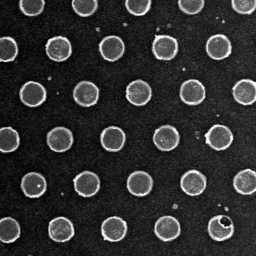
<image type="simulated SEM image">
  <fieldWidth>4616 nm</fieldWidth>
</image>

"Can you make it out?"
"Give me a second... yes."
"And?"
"a regular array of raised bodies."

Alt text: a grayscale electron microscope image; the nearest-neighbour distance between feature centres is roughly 0.941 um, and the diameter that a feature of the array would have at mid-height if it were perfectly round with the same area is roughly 0.45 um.